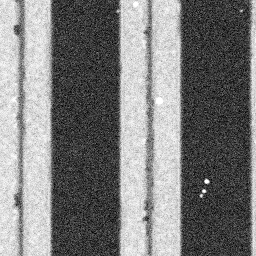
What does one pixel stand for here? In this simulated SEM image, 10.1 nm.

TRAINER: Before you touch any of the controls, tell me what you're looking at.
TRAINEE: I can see lines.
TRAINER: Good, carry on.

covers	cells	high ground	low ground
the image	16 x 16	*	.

...*****...*****
...*****...*****
...*****...*****
...*****...*****
...*****...*****
...*****...*****
...*****...*****
...*****...*****
...*****...*****
...*****...*****
...*****...*****
...*****...*****
...*****...*****
...*****...*****
...*****...*****
...*****...*****